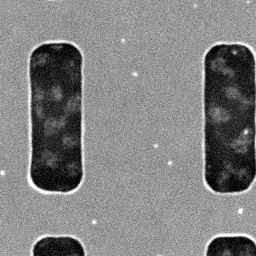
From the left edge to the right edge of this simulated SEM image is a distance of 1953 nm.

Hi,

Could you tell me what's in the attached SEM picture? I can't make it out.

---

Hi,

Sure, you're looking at holes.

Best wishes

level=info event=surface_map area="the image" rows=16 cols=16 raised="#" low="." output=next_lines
################
################
################
##...########...
##...########...
##...########...
##...########...
##...########...
##...########...
##...########...
##...########...
##...########...
################
################
################
##...########...